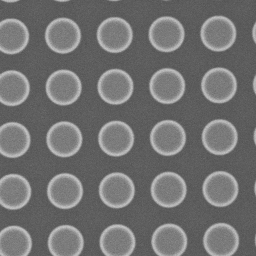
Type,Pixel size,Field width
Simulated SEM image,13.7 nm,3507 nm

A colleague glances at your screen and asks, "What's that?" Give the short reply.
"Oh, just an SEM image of an array of small figures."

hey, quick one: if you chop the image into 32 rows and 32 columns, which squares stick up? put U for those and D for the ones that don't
DDDDDDDDDDDDDDDDDDDDDDDDDDDDDDDD
DDDDDDDDDDDDDDDDDDDDDDDDDDDDDDDD
DUDDDDDUUDDDDUUUDDDDUUDDDDUUUDDD
UUUDDDUUUUDDUUUUDDDUUUUDDUUUUDDD
UUUUDDUUUUDDUUUUUDDUUUUDDUUUUDDD
UUUDDDUUUUDDUUUUDDDUUUUDDUUUUDDD
UUDDDDDUUDDDDDUDDDDDDDDDDDDDDDDD
DDDDDDDDDDDDDDDDDDDDDDDDDDDDDDDD
DDDDDDDDDDDDDDDDDDDDDDDDDDDDDDDD
UUUDDDUUUUDDDUUUDDDUUUUDDDUUUDDD
UUUUDDUUUUDDUUUUUDDUUUUDDUUUUUDD
UUUUDDUUUUDDUUUUDDDUUUUDDUUUUDDD
UUUDDDUUUDDDDUUUDDDDUUDDDDUUUDDD
DDDDDDDDDDDDDDDDDDDDDDDDDDDDDDDD
DDDDDDDDDDDDDDDDDDDDDDDDDDDDDDDD
DUDDDDDUUDDDDUUUDDDDUUDDDDUUUDDD
UUUDDDUUUUDDUUUUUDDUUUUDDUUUUUDD
UUUUDDUUUUDDUUUUUDDUUUUDDUUUUUDD
UUUUDDUUUUDDDUUUDDDUUUUDDDUUUDDD
DUDDDDDUUDDDDDUDDDDDDDDDDDDDDDDD
DDDDDDDDDDDDDDDDDDDDDDDDDDDDDDDD
DDDDDDDDDDDDDDDDDDDDDDDDDDDUDDDD
UUUDDDUUUUDDDUUUDDDUUUUDDDUUUDDD
UUUUDDUUUUDDUUUUUDDUUUUDDUUUUUDD
UUUUDDUUUUDDUUUUUDDUUUUDDUUUUUDD
UUUDDDDUUUDDDUUUDDDDUUDDDDUUUDDD
DDDDDDDDDDDDDDDDDDDDDDDDDDDDDDDD
DDDDDDDDDDDDDDDDDDDDDDDDDDDDDDDD
DUUDDDDUUDDDDUUUDDDDUUUDDDUUUDDD
UUUUDDUUUUDDDUUUUDDUUUUDDUUUUUDD
UUUUDDUUUUDDDUUUUDDUUUUDDUUUUUDD
UUUUDDUUUUDDDUUUUDDUUUUDDDUUUDDD